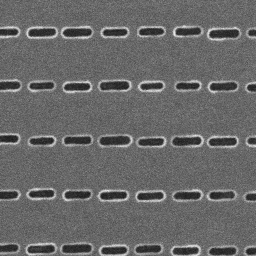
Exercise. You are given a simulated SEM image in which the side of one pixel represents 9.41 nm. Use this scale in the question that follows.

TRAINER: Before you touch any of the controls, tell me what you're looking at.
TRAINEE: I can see a regular array of holes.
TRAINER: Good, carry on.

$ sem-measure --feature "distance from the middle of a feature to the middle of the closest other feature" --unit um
0.338